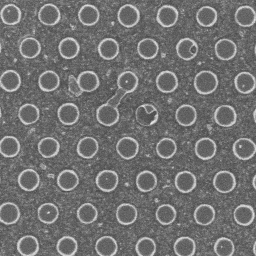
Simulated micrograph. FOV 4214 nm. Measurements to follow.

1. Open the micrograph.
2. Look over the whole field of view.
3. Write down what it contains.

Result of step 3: a regular array of raised bodies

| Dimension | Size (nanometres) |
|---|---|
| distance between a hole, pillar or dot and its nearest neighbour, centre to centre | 628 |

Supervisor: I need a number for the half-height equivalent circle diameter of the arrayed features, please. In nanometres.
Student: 333